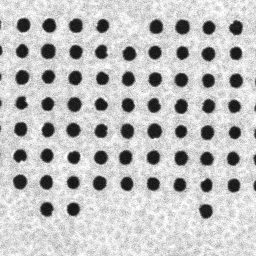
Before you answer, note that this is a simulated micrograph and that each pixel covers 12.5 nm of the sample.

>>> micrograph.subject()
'a regular array of holes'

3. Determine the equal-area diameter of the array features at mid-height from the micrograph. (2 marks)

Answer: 14.1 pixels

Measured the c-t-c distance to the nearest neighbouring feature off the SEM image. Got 322 nanometers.